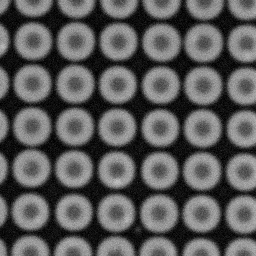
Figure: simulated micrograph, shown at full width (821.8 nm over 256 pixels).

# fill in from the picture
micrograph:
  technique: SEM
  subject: an array of small figures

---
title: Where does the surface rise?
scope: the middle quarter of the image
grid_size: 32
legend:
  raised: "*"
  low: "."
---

..**............................
******.....*****......*****.....
*******...*******....*******...*
*******..*********..********...*
*******..*********..*********.**
*******..*********..*********.**
*******..*********..*********.**
*******..********...********...*
******....*******....*******...*
.***........***.......****......
................................
.****.......***.................
******....******.....******.....
*******..********...********...*
*******..*********..********..**
*******..*********..*********.**
*******..*********..*********.**
*******..*********..********..**
******...********...********...*
******....******.....******....*
................................
................................
*****......****.......****......
******....*******....******....*
*******..********...********..**
*******..*********..********..**
*******..*********..*********.**
*******..*********..*********.**
*******..********...********..**
******....*******...********...*
.***.......****......*****......
................................